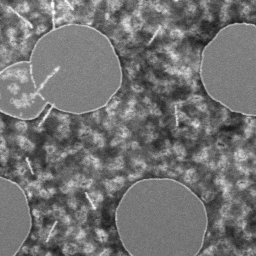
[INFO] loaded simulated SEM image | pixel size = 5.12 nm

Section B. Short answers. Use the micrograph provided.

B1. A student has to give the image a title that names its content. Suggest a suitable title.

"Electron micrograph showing raised bodies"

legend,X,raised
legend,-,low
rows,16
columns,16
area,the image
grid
----------------
---------------X
--XXXXX------XXX
--XXXXX------XXX
XXXXXXXX-----XXX
XXXXXXX------XXX
XXXXXXX-------XX
----------------
----------------
----------------
----------------
X-------XXX-----
XX------XXXX----
XX-----XXXXXX---
XX-----XXXXXX---
X-------XXXXX---